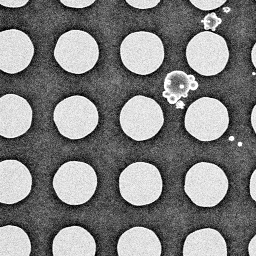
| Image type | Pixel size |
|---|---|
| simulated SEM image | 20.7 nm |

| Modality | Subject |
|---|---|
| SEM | an array of small figures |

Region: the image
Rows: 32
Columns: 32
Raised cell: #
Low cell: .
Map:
###.....###.....####....####....
................................
..........................#.....
................................
###.....###.....####....###.....
####...#####...#####....####....
####...#####...#####...######...
####...#####...#####...#####....
###.....###.....####....####....
.....................##.........
.....................###........
.....................##.........
###.....###.....###..#...##.....
####...#####...#####....####....
####...#####...#####...#####...#
####...#####...#####...#####....
###.....###.....####....####....
.........................#......
................................
................................
###.....###......##......#......
####...#####...#####....####....
####...#####...#####...#####...#
####...#####...#####...#####...#
###....####....#####....####...#
.........#.......#.......##.....
................................
................................
##......##.......#..............
###....####....####.....####....
####...#####...#####...#####...#
####...#####...#####...#####...#